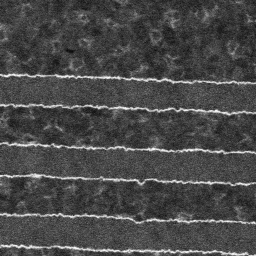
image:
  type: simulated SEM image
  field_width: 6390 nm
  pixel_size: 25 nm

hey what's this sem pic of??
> one or a few lines or trenches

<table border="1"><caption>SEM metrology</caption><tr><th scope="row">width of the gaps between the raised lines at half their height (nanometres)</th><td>758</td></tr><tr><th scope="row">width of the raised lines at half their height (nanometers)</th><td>982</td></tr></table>